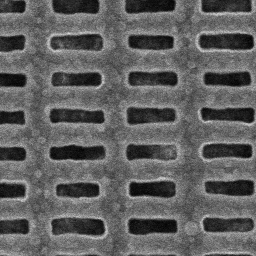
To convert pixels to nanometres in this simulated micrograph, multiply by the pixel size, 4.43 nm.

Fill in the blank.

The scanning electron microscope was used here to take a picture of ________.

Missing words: a regular array of holes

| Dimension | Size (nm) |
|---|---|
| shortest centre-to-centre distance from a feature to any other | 163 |